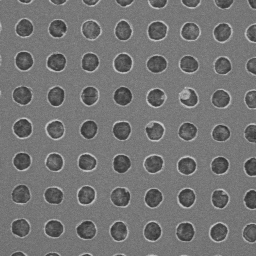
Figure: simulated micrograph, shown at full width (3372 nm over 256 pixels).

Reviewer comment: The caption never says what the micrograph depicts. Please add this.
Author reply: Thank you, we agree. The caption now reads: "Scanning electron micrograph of a regular array of holes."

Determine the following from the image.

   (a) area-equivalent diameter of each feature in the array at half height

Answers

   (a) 244 nm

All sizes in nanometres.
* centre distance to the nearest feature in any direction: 427